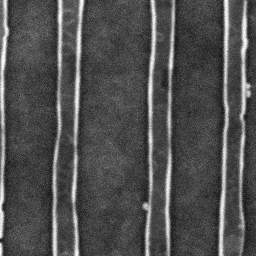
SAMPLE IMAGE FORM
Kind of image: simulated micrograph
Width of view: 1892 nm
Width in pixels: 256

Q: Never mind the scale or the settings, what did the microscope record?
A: one or a few lines or trenches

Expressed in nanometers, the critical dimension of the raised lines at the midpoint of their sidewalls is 139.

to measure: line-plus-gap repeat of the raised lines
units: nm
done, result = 616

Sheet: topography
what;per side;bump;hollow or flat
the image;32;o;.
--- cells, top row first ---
o.......oo.........ooo......ooo.
o.......oo.........ooo......ooo.
o.......oo.........ooo......ooo.
o.......oo.........ooo......oo..
o......ooo.........ooo......oo..
o......ooo.........oo.......ooo.
o.......oo.........oo.......oo..
........oo.........oo.......oo..
........oo.........oo.......oo..
.......ooo.........oo.......oo..
.......ooo.........oo.......oo..
.......ooo.........oo.......oo..
.......ooo.........oo.......oo..
.......ooo.........oo.......oo..
........oo.........oo.......oo..
.......ooo.........oo.......oo..
.......oo..........oo.......oo..
.......oo..........oo.......oo..
.......oo..........oo.......oo..
.......oo..........oo.......oo..
.......oo..........oo.......oo..
.......oo..........oo.......oo..
.......oo..........oo.......oo..
.......oo..........oo.......oo..
.......oo..........oo.......oo..
.......oo..........oo.......oo..
.......oo..........oo.......oo..
.......oo..........oo.......oo..
.......ooo........ooo.......oo..
.......ooo........ooo.......oo..
.......ooo........ooo.......oo..
.......ooo........ooo.......oo..